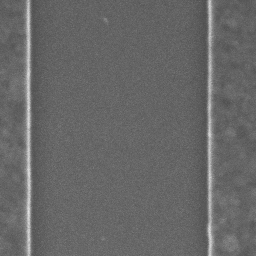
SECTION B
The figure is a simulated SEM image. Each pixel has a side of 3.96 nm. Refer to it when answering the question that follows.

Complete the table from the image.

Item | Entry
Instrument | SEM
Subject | one or a few lines or trenches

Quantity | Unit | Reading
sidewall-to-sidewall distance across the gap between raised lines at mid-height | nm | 713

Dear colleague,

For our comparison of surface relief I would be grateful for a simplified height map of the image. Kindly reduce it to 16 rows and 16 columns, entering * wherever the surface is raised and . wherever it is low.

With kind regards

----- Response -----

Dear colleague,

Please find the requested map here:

**...........***
**...........***
**...........***
**...........***
**...........***
**...........***
**...........***
**...........***
**...........***
**...........***
**...........***
**...........***
**...........***
**...........***
**...........***
**...........***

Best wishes